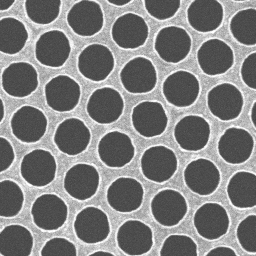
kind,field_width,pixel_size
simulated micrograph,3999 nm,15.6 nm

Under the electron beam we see a regular array of holes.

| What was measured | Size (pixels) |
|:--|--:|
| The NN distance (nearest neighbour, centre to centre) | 44.7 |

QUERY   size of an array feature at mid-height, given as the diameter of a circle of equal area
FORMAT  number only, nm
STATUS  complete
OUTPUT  560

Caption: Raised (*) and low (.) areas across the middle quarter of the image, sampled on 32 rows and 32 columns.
****........***.......**********
****........**.........*********
*****......***.........****.....
..****....****.........***......
...***********.........**.......
....***********........**.......
....****.....***......***.......
....***.......***********.......
....**........***********.......
....**.........*****...***......
...***.........***......****...*
..****.........**........*******
******........***........*******
*******.......***.........****..
.....***....*****.........***...
.....************.........**....
......************.......***....
.......****....****.....****....
......***.......************....
......***........***********....
......***........******..****...
.....***..........***......****.
*..******.........**........****
*********........**.........****
**********......***.........****
**.....****....****.........***.
*.......************........**..
.........***********.......***..
.........*****..*****.....****..
.........***.......****..*****..
.........***.......************.
........***.........*****..*****